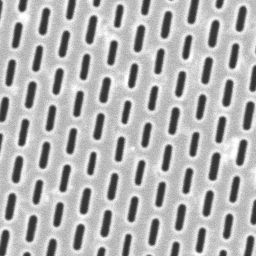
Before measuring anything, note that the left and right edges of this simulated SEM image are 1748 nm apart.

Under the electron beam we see a regular array of holes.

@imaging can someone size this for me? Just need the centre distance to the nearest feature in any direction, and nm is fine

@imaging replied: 207